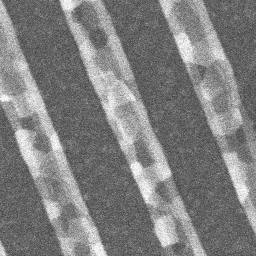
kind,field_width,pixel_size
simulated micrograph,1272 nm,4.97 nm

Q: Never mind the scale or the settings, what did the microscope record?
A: one or a few lines or trenches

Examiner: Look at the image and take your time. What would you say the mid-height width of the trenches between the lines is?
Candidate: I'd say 316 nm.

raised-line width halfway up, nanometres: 145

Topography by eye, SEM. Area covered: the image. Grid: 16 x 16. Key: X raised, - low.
----XX----XXX---
-----XX----XX---
X----XX----XX---
X----XXX----XX--
XX----XX----XX--
XX----XX----XXX-
XX-----XX----XX-
-XX----XX----XX-
-XX-----X-----XX
--XX----XX----XX
--XX----XX-----X
---X-----XX----X
---XX----XX----X
---XX-----X-----
----XX----XX----
----XX----XX----